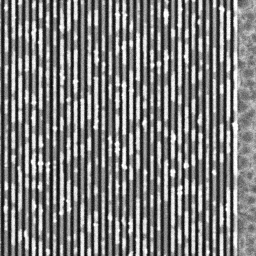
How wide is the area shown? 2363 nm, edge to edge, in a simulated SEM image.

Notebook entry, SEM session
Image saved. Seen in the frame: parallel lines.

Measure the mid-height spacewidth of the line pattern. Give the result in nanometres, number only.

35.8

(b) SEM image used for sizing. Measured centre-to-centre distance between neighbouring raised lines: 6.94 pixels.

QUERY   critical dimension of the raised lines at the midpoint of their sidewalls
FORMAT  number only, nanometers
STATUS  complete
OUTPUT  26.5